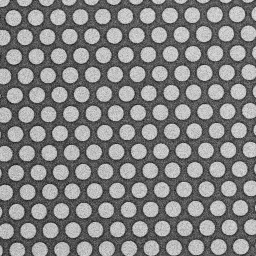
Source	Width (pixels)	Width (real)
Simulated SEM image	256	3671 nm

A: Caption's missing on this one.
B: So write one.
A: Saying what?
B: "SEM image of an array of small figures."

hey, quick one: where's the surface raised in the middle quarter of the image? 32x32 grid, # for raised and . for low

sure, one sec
.............................#..
###...###..###...###..####..###.
###..####..####..###..####..###.
###...###..###...###..####..###.
.##.............................
.....................#....##....
...###..####..###..####..####..#
#..###..####..####.####..####..#
#..###..####..###...###..###...#
................................
............##....#....##....##.
###...###..####..###..####..####
####..###..####..###..####..####
###...###..####..###...##...###.
................................
....#....##....##...###...##...#
#..###..####..####..###..####..#
#..###..####..####..###..####..#
#..###...###..###...###...##....
................................
.##....##...##...###...###..###.
####..###..####..####.####..####
####..###..####..####..###..####
.##...###...##....##....#.......
................................
....##...###...##...###...###..#
#..####..###..####..###..####..#
#..####..###..####..###..####..#
....##...##....##...............
................................
.##...###...###..###...###..####
####..###..####..####..###..####